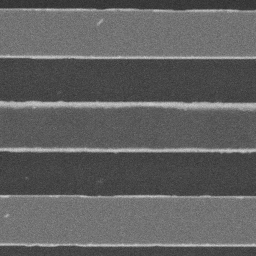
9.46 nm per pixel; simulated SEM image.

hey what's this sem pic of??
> lines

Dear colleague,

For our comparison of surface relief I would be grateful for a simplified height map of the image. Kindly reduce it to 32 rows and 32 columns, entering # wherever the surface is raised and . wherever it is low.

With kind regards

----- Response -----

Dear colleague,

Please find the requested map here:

................................
################################
################################
################################
################################
################################
################################
................................
................................
................................
................................
................................
................................
################################
################################
################################
################################
################################
################################
................................
................................
................................
................................
................................
###########...########....#.....
################################
################################
################################
################################
################################
################################
................................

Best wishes